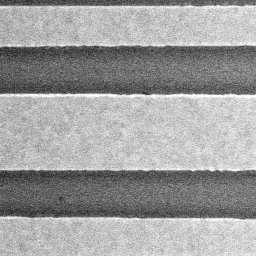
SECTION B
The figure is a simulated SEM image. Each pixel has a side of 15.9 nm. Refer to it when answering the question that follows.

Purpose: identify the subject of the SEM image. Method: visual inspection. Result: lines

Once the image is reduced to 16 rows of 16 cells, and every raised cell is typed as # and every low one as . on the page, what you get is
################
################
################
................
................
................
################
################
################
################
################
................
................
................
################
################